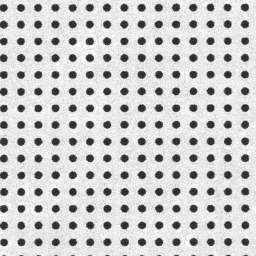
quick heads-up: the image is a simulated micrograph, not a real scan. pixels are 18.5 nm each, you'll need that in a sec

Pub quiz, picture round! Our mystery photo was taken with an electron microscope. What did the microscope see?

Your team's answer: a regular array of holes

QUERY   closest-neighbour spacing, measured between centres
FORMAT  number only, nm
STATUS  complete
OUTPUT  307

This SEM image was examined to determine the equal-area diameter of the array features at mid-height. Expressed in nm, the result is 156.